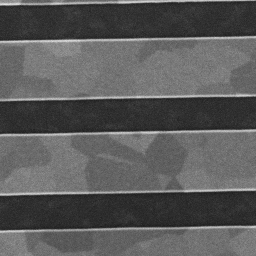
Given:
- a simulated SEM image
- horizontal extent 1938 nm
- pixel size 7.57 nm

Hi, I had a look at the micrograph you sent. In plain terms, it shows one or a few lines or trenches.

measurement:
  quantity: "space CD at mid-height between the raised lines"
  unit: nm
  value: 274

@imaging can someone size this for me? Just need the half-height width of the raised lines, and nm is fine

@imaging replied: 446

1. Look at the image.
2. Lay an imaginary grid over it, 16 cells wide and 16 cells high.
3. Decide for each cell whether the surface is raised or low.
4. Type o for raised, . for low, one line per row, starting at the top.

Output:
................
................
.......ooooooooo
oooooooooooooooo
oooooooooooooooo
oooooooooooooooo
................
................
oooooooooooooooo
oooooooooooooooo
oooooooooooooooo
oooooooooooooooo
................
................
oooooooooooooooo
oooooooooooooooo